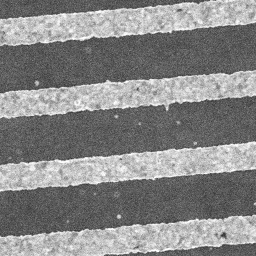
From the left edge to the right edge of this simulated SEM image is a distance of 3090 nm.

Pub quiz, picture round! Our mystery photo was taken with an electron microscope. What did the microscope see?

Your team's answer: one or a few lines or trenches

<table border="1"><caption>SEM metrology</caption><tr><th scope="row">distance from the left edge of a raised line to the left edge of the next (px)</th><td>72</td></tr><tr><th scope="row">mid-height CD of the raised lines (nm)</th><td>308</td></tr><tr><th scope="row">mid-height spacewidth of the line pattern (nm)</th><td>563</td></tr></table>